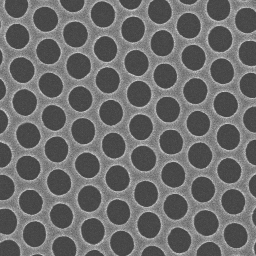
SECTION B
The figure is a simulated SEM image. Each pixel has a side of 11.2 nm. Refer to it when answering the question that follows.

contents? a regular array of holes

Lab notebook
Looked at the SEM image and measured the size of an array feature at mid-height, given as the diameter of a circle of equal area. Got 276 nm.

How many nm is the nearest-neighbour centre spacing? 356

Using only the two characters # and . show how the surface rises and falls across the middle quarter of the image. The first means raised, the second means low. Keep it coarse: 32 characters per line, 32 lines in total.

#......########......###...###..
#......##....###.....##.....####
#.....##......###...##......####
###..###......########......####
########......###...###.....###.
########......##.....###...###..
##....###....###......########..
#......#########......########..
#......#########......##...###..
#......###...###.....##.....###.
##.....##.....####..###......###
###...###......########......###
#########......########......###
#########......##....###....###.
###....###....##......###..####.
##......########......#########.
##......########......####..###.
##......###...###.....##.....###
##.....###.....###...###......##
###....###.....#########......##
.########......####.####......##
.#########.....##.....###....##.
.###...###.....##......###..###.
###.....####.####......########.
###......########......####.###.
###......###..####.....##....###
###......##....####...###.....##
.###....##......########......##
..####.###......########......##
..#########.....###...###.....##
..####.####.....##.....###...###
.###....####...###.....#########